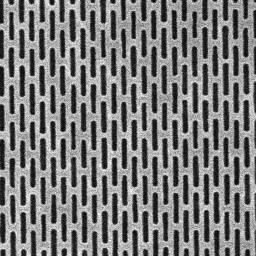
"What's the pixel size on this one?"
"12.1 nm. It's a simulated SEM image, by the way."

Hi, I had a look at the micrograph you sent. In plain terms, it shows a regular array of holes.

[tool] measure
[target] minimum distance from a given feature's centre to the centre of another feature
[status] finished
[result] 243 nanometres